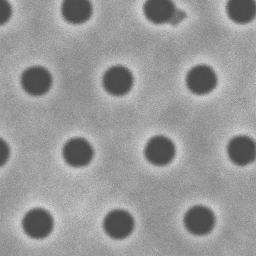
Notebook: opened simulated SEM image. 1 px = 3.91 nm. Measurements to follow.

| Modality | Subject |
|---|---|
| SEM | a regular array of holes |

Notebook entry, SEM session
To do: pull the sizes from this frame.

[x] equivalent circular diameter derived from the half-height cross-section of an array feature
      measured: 121 nanometers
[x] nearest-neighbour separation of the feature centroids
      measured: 317 nanometres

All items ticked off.